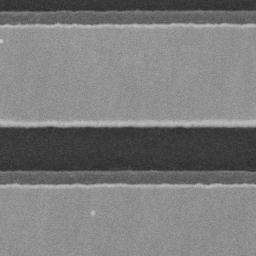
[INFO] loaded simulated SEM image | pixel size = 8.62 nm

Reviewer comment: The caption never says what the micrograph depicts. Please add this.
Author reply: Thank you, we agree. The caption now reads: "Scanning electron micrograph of lines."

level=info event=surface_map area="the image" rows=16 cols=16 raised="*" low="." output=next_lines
................
****************
****************
****************
****************
****************
****************
****************
................
................
................
****************
****************
****************
****************
****************